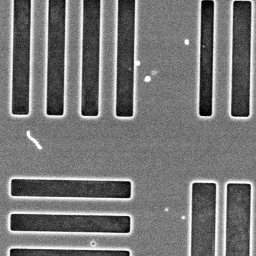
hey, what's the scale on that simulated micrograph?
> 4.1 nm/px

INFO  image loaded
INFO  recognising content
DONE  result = groups of lines, slits or small figures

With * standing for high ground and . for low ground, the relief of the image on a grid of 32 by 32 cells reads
**..**..**...**..********..**..*
**..**..**...**..********..**..*
**..**..**...**..********..**..*
**..**..**...**..********..**..*
**..**..**..***..********..**..*
**..**..**..***..********..**..*
**..**..**..***..********..**..*
**..**..**..***..********..**..*
**..**..**..***..********..**..*
**..**..**..***..********..**..*
*...**..**..***..********..**..*
*...**..**..**...********..**..*
*...**..**..**...********..**..*
*...**..**..**...********..**..*
***********.***.*************..*
********************************
********************************
********************************
********************************
********************************
********************************
********************************
**........**********************
*...............********...*...*
**..............********...*...*
************************...*...*
************************...*...*
*...............********...*...*
*...............********...*...*
************************...*...*
************************...*...*
*...............********...*...*